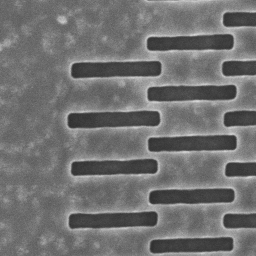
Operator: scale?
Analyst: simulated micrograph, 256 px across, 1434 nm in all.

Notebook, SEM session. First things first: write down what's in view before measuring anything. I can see a regular array of holes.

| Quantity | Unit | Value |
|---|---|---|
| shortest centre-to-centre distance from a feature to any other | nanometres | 279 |